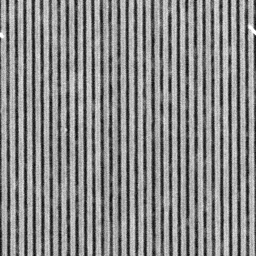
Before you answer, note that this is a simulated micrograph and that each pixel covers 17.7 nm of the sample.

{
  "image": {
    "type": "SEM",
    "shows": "parallel lines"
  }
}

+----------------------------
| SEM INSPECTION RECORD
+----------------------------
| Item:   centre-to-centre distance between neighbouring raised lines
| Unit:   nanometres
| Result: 151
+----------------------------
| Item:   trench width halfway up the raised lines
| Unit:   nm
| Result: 77.6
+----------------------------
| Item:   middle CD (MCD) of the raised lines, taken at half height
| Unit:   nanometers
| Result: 77.6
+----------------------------